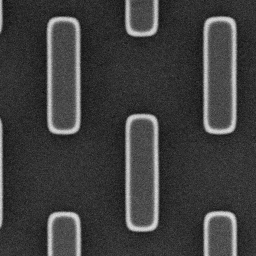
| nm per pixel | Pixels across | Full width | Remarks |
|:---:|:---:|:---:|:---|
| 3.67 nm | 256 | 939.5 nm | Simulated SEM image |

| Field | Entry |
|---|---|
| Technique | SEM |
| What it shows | groups of lines, slits or small figures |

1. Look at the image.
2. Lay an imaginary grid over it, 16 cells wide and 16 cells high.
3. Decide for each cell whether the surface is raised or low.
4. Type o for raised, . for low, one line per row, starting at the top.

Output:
........oo......
...oo...oo...oo.
...oo........oo.
...oo........oo.
...oo........oo.
...oo........oo.
...oo........oo.
...oo...oo...oo.
........oo......
........oo......
........oo......
........oo......
........oo......
...oo...oo...o..
...oo........oo.
...oo........oo.